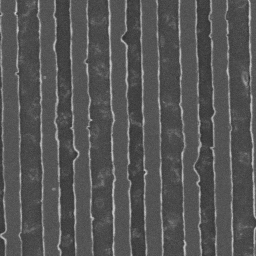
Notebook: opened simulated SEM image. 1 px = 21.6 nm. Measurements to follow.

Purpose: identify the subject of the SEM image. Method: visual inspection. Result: parallel lines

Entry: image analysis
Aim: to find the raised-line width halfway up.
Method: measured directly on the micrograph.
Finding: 16.6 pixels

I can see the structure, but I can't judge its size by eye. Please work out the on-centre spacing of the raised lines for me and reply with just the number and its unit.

756 nanometers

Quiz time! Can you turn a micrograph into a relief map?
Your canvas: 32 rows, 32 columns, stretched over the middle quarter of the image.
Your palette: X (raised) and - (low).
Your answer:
--XXXX------XXXX----XXXX-----XXX
--XXXX------XXXX----XXXX-----XXX
--XXXX------XXXX----XXXX-----XXX
--XXXX------XXXX----XXXX-----XXX
--XXXX------XXXX----XXXX-----XXX
--XXXX------XXXX----XXXX-----XXX
--XXXX------XXXX----XXXX-----XXX
--XXXX------XXXX----XXXX-----XXX
--XXXX------XXXX----XXXX-----XXX
--XXXX------XXXX----XXXX-----XXX
--XXXX------XXXX----XXXX-----XXX
--XXXX------XXXX----XXXX-----XXX
--XXXX------XXXX----XXXX------XX
--XXXX------XXXX----XXXX-----XXX
--XXXXX-----XXXX----XXXX------XX
--XXXX------XXXX----XXXX------XX
--XXXX------XXXX----XXXX------XX
--XXXX------XXXX----XXXX------XX
--XXXX------XXXX----XXXX------XX
--XXXX------XXXX----XXXX------XX
---XXX------XXXX----XXXX------XX
---XXX------XXXX----XXXX------XX
----XX------XXXX----XXXX------XX
---XXX------XXXX----XXXX------XX
--XXXX------XXXX----XXXX-----XXX
--XXXXX-----XXXX----XXXX------XX
--XXXXX------XXX----XXXX------XX
--XXXXX------XXX----XXXX------XX
--XXXXX------XXX----XXXX------XX
--XXXXX------XXXX---XXXX------XX
---XXXX-----XXXXX---XXXX------XX
---XXXX-----XXXXX---XXXX------XX